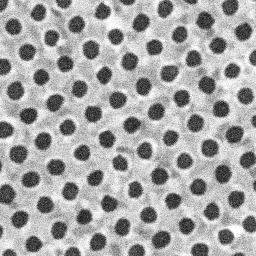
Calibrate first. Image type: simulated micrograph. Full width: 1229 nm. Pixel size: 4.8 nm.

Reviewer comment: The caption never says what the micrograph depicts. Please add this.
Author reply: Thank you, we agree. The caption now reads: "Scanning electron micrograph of a regular array of holes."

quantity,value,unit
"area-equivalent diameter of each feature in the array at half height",89.6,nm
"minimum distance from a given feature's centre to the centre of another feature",134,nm